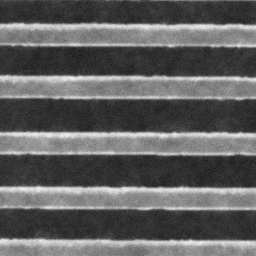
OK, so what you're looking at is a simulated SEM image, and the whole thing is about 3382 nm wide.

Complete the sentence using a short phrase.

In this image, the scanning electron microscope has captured lines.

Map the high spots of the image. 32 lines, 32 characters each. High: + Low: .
................................
................................
................................
++++++++++++++++++++++++++++++++
++++++++++++++++++++++++++++++++
++++++++++++++++++++++++++++++++
................................
................................
................................
................................
++++++++++++++++++++++++++++++++
++++++++++++++++++++++++++++++++
................................
................................
................................
................................
................................
++++++++++++++++++++++++++++++++
++++++++++++++++++++++++++++++++
................................
................................
................................
................................
................................
++++++++++++++++++++++++++++++++
++++++++++++++++++++++++++++++++
................................
................................
................................
................................
+++++++++++++++++++++++++++++++.
++++++++++++++++++++++++++++++++